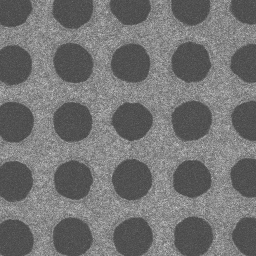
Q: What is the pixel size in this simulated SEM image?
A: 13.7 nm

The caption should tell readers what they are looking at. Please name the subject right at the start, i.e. a regular array of holes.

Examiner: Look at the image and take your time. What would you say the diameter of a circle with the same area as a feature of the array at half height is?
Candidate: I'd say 0.546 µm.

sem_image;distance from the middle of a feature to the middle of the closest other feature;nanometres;795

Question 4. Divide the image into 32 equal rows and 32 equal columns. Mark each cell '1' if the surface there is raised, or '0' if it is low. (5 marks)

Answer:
00001110000011000001100000111000
00001110000011000001110000111000
00011110000111100011110001111100
11111111001111111111111111111111
11111111111111111111111111111111
11111111001111110111111001111110
00011110000111000011110000111000
00001110000011000001100000111000
00001110000011000001110000111000
00001110000111000011110000111100
10111111111111111111111111111111
11111111111111111111111111111111
11111111111111111111111111111111
00011110000111100011110000111000
00001110000111000001100000111000
00001110000011000001110000111000
00001110000111100011110000111100
10011111001111110111111011111110
11111111111111111111111111111111
11111111111111111111111111111111
00011111001111100011111001111100
00001110000111000001110000111000
00001110000011000001110000111000
00001110000111000001110000111000
00011111000111100011111001111110
11111111111111111111111111111111
11111111111111111111111111111111
10111111001111110011111001111100
00001110000111000001110000111000
00001110000111000001110000011000
00001110000111000001110000111000
00001110000111100011110000111100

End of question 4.